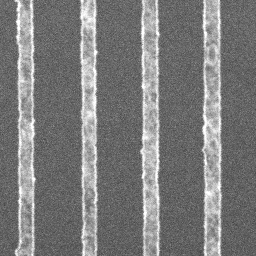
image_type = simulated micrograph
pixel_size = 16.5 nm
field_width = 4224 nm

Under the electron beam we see one or a few lines or trenches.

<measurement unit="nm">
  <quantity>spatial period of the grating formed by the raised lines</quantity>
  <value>1020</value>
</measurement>